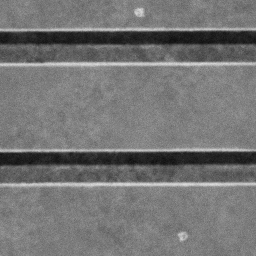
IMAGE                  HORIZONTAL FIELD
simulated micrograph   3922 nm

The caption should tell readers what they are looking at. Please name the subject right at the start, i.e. lines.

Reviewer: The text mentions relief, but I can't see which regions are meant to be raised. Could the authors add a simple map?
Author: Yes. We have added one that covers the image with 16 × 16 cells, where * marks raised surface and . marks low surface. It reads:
****************
****************
................
................
****************
****************
****************
****************
****************
................
................
.***************
****************
****************
****************
****************